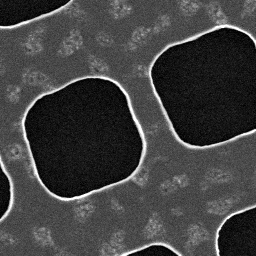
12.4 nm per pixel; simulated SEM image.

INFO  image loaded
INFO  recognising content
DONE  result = holes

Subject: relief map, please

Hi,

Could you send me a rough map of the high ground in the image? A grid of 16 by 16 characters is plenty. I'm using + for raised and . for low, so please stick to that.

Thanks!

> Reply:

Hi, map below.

....++++++++++++
.+++++++++++++++
++++++++++++....
++++++++++......
+++++++++.......
++++...+++......
++......++......
++......+++.....
++.......++....+
++.......+++++++
++.......+++++++
.++....+++++++++
.+++++++++++++++
+++++++++++++++.
++++++++++++++..
+++++++++.++++..